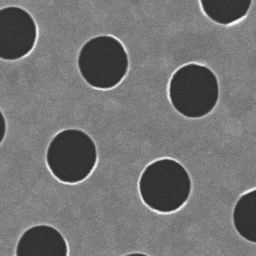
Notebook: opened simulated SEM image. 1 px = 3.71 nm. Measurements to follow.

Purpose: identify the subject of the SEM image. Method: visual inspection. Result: holes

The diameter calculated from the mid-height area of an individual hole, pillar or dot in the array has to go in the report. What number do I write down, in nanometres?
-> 186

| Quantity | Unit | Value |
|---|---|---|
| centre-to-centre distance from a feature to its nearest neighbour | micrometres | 0.358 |